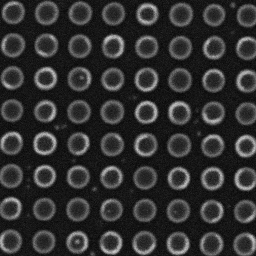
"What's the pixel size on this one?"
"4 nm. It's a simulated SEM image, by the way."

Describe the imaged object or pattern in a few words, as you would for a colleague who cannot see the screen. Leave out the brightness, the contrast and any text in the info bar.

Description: a regular array of raised bodies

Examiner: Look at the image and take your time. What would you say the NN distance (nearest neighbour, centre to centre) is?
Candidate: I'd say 129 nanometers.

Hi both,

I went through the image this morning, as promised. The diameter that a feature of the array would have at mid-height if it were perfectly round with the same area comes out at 87.2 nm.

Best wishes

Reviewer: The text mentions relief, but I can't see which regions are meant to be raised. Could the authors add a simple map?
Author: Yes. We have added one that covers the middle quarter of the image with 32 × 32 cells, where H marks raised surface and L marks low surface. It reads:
LLLLLLLLLLLLLLLLLLLLLLLLLLLLLLLL
LLHHHHLLLLLHHLLLLLLHHHLLLLLLHHLL
LHHHHHLLLLHHHHLLLLHHHHHLLLLHHHHL
LHHHHHLLLLHHHHHLLLHHHHHLLLHHHHHH
LHHHHHLLLLHHHHHLLLHHHHHLLLHHHHHH
LLHHHHLLLLHHHHLLLLHHHHHLLLLHHHHL
LLLLLLLLLLLLLLLLLLLLHLLLLLLLHHLL
LLLLLLLLLLLLLLLLLLLLLLLLLLLLLLLL
LLLLLLLLLLLLLLLLLLLLLLLLLLLLLLLL
LLLHHLLLLLLHHLLLLLLLHLLLLLLLHLLL
LLHHHHLLLLHHHHHLLLLHHHHLLLHHHHHL
LHHHHHLLLHHHHHHLLLHHHHHLLLHHHHHL
LHHHHHLLLHHHHHHLLLHHHHHLLLHHHHHL
LHHHHHLLLLHHHHLLLLHHHHHLLLLHHHHL
LLLHHLLLLLLHHLLLLLLHHHLLLLLLHHLL
LLLLLLLLLLLLLLLLLLLLLLLLLLLLLLLL
LLLLLLLLLLLLLLLLLLLLLLLLLLLLLLLL
LLLHHLLLLLLLLLLLLLLLLLLLLLLLLLLL
LLHHHHLLLLHHHHLLLLHHHHHLLLLHHHHL
LHHHHHLLLLHHHHHLLLHHHHHLLLHHHHHL
LHHHHHLLLLHHHHHLLLHHHHHLLLHHHHHL
LHHHHHLLLLHHHHLLLLHHHHHLLLHHHHHL
LLLLLLLLLLLHHLLLLLLHHHLLLLLHHHLL
LLLLLLLLLLLLLLLLLLLLLLLLLLLLLLLL
LLLLLLLLLLLLLLLLLLLLLLLLLLLLLLLL
LLLLLLLLLLLLLLLLLLLLLLLLLLLLLLLL
LLHHHLLLLLHHHHLLLLLHHHLLLLLHHHHL
LHHHHHLLLLHHHHLLLLHHHHHLLLHHHHHL
LHHHHHLLLLHHHHLLLLHHHHHLLLHHHHHL
LHHHHHLLLLHHHHLLLLHHHHHLLLHHHHHL
LLHHHLLLLLLHHLLLLLHHHHLLLLLHHHLL
LLLLLLLLLLLLLLLLLLLLLLLLLLLLLLLL